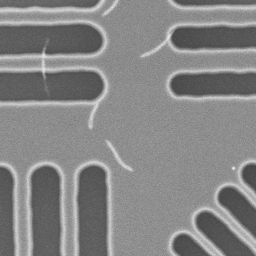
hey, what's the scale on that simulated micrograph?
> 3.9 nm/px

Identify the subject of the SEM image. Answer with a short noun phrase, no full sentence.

groups of lines, slits or small figures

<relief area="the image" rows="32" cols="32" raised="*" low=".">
............**********..........
********************************
********************************
............**********..........
.............********...........
.............*********..........
............********************
********************************
********************************
.............*********..........
.............********...........
.............*********..........
............********************
********************************
********************************
********************************
********************************
********************************
********************************
********************************
*******************************.
.***...***...*****************..
..**....**...*****************..
..**....**...***************.**.
..**....**....*************....*
..**....**....**************....
..**....**....***********.***...
..**....**....**********....**..
..**....**....***********....*..
..**....**....********..**....**
..**....**....********...**....*
..**....**....********....**....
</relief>